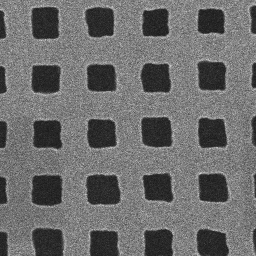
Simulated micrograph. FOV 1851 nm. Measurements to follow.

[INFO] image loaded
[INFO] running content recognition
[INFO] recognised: a regular array of holes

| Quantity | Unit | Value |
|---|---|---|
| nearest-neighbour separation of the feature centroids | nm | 397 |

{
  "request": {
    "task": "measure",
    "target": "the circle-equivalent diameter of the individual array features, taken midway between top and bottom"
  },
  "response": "222 nanometers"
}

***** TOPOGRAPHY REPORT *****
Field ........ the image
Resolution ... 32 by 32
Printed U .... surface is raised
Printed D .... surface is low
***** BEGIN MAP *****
UUUUUUUUUUUUUUUUUUUUUUUUUUUUUUUU
UUUUDDDUUUUDDDUUUUDDDUUUUDDDUUUD
UUUUDDDUUUUDDDUUUUDDDUUUUDDDUUUD
DUUUDDDUUUUDDDUUUUDDDUUUUDDDUUUD
DUUUDDDUUUUDDUUUUUDDDUUUUUUUUUUU
UUUUUUUUUUUUUUUUUUUUUUUUUUUUUUUU
UUUUUUUUUUUUUUUUUUUUUUUUUUUUUUUU
UUUUUUUUUUUUUUUUUUUUUUUUUUUUUUUU
UUUUDDDUUUUDDDUUUUDDDUUUUDDDUUUU
DUUUDDDDUUUDDDUUUUDDDUUUUDDDUUUU
DUUUDDDUUUUDDDUUUUDDDUUUUDDDUUUU
UUUUDDDUUUUUUUUUUUUDDUUUUUUUUUUU
UUUUUUUUUUUUUUUUUUUUUUUUUUUUUUUU
UUUUUUUUUUUUUUUUUUUUUUUUUUUUUUUU
UUUUUUUUUUUUUUUUUUUUUUUUUUUUUUUU
DUUUDDDDUUUDDDUUUUDDDUUUUDDDUUUU
DUUUDDDDUUUDDDUUUUDDDUUUUDDDUUUU
DUUUDDDDUUUDDDUUUUDDDUUUUDDDUUUU
UUUUUDUUUUUUDUUUUUUUUUUUUUUUUUUU
UUUUUUUUUUUUUUUUUUUUUUUUUUUUUUUU
UUUUUUUUUUUUUUUUUUUUUUUUUUUUUUUU
UUUUUUUUUUUUUUUUUUUUUUUUUUUUUUUU
DUUUDDDDUUUDDDDUUUDDDUUUUDDDUUUU
DUUUDDDDUUUDDDDUUUDDDUUUUDDDUUUU
DUUUDDDDUUUDDDDUUUDDDDUUUDDDUUUU
UUUUUDDUUUUUDDUUUUUUUUUUUUUUUUUU
UUUUUUUUUUUUUUUUUUUUUUUUUUUUUUUU
UUUUUUUUUUUUUUUUUUUUUUUUUUUUUUUU
UUUUUUUUUUUUUUUUUUUUUUUUUUUUUUUU
DUUUDDDDUUUDDDDUUUDDDDUUUDDDUUUU
DUUUDDDDUUUDDDDUUUDDDDUUUDDDUUUU
DUUUDDDDUUUDDDDUUUDDDDUUUDDDDUUU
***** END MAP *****